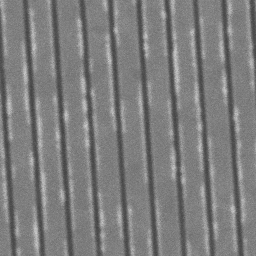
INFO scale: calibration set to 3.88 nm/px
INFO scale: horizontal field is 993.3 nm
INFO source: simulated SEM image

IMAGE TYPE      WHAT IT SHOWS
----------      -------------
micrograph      parallel lines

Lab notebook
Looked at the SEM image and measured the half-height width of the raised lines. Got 85.1 nanometres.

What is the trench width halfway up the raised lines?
25.6 nm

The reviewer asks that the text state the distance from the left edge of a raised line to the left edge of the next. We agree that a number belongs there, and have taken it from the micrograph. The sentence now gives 110 nanometres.